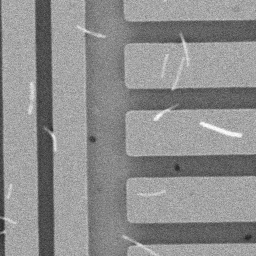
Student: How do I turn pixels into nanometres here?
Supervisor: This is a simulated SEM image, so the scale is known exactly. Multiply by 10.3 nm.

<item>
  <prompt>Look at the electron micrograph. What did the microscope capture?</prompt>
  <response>groups of lines, slits or small figures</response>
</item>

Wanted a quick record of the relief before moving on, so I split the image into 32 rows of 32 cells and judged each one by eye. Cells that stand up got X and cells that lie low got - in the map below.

XXXX--XXXXX-----XXXXXXXXXXXXXXXX
XXXX---XXXX-----XXXXXXXXXXXXXXXX
XXXX---XXXX-----XXXXXXXXXX------
XXXX---XXXX---------------------
XXXX---XXXX---------------------
XXXX---XXXX-----XXXXXXXXXXXXXXXX
XXXX---XXXX-----XXXXXXXXXXXXXXXX
XXXX---XXXX-----XXXXXXXXXXXXXXXX
XXXX---XXXX-----XXXXXXXXXXXXXXXX
XXXX---XXXX-----XXXXXXXXXXXXXXXX
XXXX---XXXX-----XXXXXXXXXXXXXXXX
XXXX---XXXX---------------------
XXXX---XXXX---------------------
XXXX---XXXX---------------------
XXXX---XXXX-----XXXXXXXXXXXXXXXX
XXXX---XXXX-----XXXXXXXXXXXXXXXX
XXXXX--XXXX-----XXXXXXXXXXXXXXXX
XXXXX--XXXX-----XXXXXXXXXXXXXXXX
XXXXX--XXXX-----XXXXXXXXXXXXXXXX
-XXXX--XXXX---------------------
-XXXX--XXXX---------------------
-XXXX--XXXX---------------------
-XXXX--XXXX-----XXXXXXXXXXXXXXXX
-XXXX--XXXX-----XXXXXXXXXXXXXXXX
-XXXX--XXXX-----XXXXXXXXXXXXXXXX
-XXXX--XXXX-----XXXXXXXXXXXXXXXX
-XXXX--XXXX-----XXXXXXXXXXXXXXXX
-XXXX--XXXX-----XXXXXXXXXXXXXXXX
-XXXX--XXXX---------------------
-XXXX--XXXX---------------------
-XXXX--XXXX---------------------
-XXXX--XXXX-----XXXXXXXXXXXXXXXX